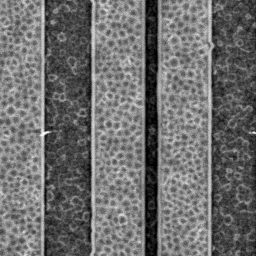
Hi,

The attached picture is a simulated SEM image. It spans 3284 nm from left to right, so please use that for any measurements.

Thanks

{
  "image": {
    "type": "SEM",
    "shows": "one or a few lines or trenches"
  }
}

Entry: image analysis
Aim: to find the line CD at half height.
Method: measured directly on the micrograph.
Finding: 653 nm